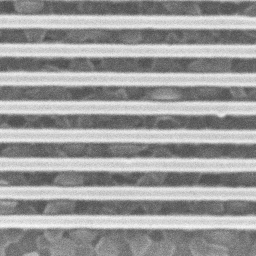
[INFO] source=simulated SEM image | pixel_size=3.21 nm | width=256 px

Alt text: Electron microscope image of parallel lines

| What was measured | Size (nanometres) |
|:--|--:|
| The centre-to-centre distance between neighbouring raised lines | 91.8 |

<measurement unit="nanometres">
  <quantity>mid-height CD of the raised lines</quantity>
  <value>33.8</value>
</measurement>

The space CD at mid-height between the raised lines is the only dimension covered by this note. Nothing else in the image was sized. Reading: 0.0591 microns